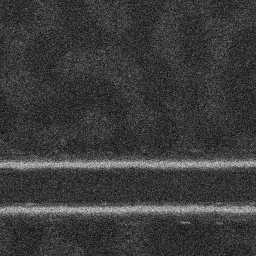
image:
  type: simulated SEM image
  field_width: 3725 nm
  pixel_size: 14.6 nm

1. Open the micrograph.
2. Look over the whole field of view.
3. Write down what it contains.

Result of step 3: one or a few lines or trenches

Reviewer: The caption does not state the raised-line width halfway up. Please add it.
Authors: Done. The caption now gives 651 nanometres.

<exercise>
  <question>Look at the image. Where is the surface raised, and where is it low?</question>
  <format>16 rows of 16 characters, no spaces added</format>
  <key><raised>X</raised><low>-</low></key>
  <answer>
----------------
----------------
----------------
----------------
----------------
----------------
----------------
----------------
----------------
----------------
XXXXXXXXXXXXXXXX
XXXXXXXXXXXXXXXX
XXXXXXXXXXXXXXXX
----------------
----------------
----------------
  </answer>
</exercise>